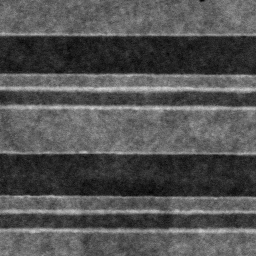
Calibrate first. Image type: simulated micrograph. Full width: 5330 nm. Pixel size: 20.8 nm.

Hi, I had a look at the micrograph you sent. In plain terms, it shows lines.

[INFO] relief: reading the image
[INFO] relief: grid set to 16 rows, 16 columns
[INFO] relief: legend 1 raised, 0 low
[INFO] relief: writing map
1111111111111111
1111111111111111
0000000000000000
0000000000000000
0000000000000000
1111111111111111
1111111111111111
1111111111111111
1111111111111111
1111111111111111
0000000000000000
0000000000000000
1111111111111111
1111111111111111
1111111111111111
1111111111111111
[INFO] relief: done